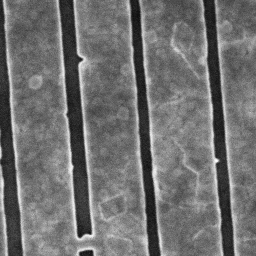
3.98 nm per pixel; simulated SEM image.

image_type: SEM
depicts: one or a few lines or trenches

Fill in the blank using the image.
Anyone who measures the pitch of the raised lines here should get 279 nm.